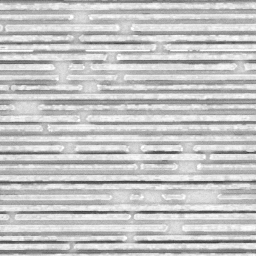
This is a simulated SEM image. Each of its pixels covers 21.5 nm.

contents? parallel lines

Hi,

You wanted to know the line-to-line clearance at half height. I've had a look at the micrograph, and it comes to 0.105 micrometres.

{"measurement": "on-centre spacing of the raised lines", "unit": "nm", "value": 215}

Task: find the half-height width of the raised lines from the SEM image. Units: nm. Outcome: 126